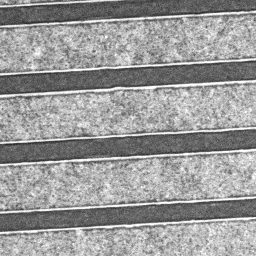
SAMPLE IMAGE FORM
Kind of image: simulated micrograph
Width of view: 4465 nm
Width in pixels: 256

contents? one or a few lines or trenches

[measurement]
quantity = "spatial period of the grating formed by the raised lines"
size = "1.2 microns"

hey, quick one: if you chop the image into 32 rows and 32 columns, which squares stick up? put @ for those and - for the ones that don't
@@@@@---------------------------
--------------------------------
---------------@@@@@@@@@@@@@@@@@
@@@@@@@@@@@@@@@@@@@@@@@@@@@@@@@@
@@@@@@@@@@@@@@@@@@@@@@@@@@@@@@@@
@@@@@@@@@@@@@@@@@@@@@@@@@@@@@@@@
@@@@@@@@@@@@@@@@@@@@@@@@@@@@@@@@
@@@@@@@@@@@@@@@@@@@@@@@@@@@@@@--
@@@@@@@@@@@@@-------------------
--------------------------------
--------------------------@@@@@@
--------@@@@@@@@@@@@@@@@@@@@@@@@
@@@@@@@@@@@@@@@@@@@@@@@@@@@@@@@@
@@@@@@@@@@@@@@@@@@@@@@@@@@@@@@@@
@@@@@@@@@@@@@@@@@@@@@@@@@@@@@@@@
@@@@@@@@@@@@@@@@@@@@@@@@@@@@@@@@
@@@@@@@@@@@@@@@@@@@@@@@---------
@@@@@@--------------------------
--------------------------------
--------------------@@@@@@@@@@@@
---@@@@@@@@@@@@@@@@@@@@@@@@@@@@@
@@@@@@@@@@@@@@@@@@@@@@@@@@@@@@@@
@@@@@@@@@@@@@@@@@@@@@@@@@@@@@@@@
@@@@@@@@@@@@@@@@@@@@@@@@@@@@@@@@
@@@@@@@@@@@@@@@@@@@@@@@@@@@@@@@@
@@@@@@@@@@@@@@@@@@--------------
@-------------------------------
----------------------------@@@@
-----------@@@@@@@@@@@@@@@@@@@@@
@@@@@@@@@@@@@@@@@@@@@@@@@@@@@@@@
@@@@@@@@@@@@@@@@@@@@@@@@@@@@@@@@
@@@@@@@@@@@@@@@@@@@@@@@@@@@@@@@@